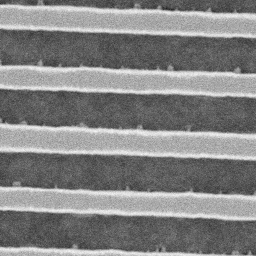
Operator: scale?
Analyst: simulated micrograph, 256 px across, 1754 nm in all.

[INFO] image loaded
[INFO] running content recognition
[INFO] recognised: lines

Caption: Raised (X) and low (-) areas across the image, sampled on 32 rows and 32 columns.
--------------------------------
XXXXXXXXXXXXXXXXXXXXXXXXXX------
XXXXXXXXXXXXXXXXXXXXXXXXXXXXXXXX
XXXXXXXXXXXXXXXXXXXXXXXXXXXXXXXX
-------------------------XXXXXXX
--------------------------------
--------------------------------
--------------------------------
XXXXXXXXXXXXX-------------------
XXXXXXXXXXXXXXXXXXXXXXXXXXXXXXXX
XXXXXXXXXXXXXXXXXXXXXXXXXXXXXXXX
--------------XXXXXXXXXXXXXXXXXX
--------------------------------
--------------------------------
--------------------------------
--------------------------------
XXXXXXXXXXXXXXXXXXXXXXX---------
XXXXXXXXXXXXXXXXXXXXXXXXXXXXXXXX
XXXXXXXXXXXXXXXXXXXXXXXXXXXXXXXX
------------------XXXXXXXXXXXXXX
--------------------------------
--------------------------------
--------------------------------
XXXX----------------------------
XXXXXXXXXXXXXXXXXXXXXXXXXXXXXXXX
XXXXXXXXXXXXXXXXXXXXXXXXXXXXXXXX
------XXXXXXXXXXXXXXXXXXXXXXXXXX
--------------------------------
--------------------------------
--------------------------------
--------------------------------
XXXXXXXXXXXXXXXX----------------